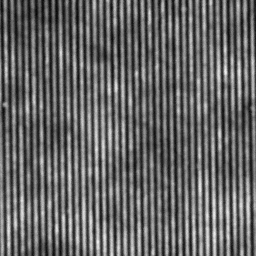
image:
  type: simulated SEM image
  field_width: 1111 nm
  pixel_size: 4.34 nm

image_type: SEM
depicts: parallel lines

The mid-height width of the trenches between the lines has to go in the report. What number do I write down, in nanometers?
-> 18.4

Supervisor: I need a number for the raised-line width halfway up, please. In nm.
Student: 11.4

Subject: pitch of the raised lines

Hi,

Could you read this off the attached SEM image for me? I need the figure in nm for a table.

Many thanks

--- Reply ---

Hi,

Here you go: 29.7